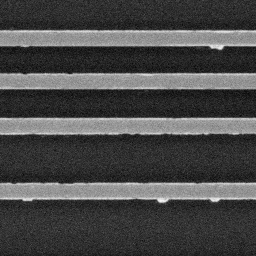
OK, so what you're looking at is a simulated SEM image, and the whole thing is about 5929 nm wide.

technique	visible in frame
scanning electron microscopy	lines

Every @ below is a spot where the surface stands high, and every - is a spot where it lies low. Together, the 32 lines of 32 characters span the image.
--------------------------------
--------------------------------
--------------------------------
--------------------------------
@@@@@@@@@@@@@@@@@@@@@@@@@@@@@@@@
@@@@@@@@@@@@@@@@@@@@@@@@@@@@@@@@
--------------------------------
--------------------------------
--------------------------------
@@@@@@@@@@@@@@@@@@@@@@@@@@@@@@@@
@@@@@@@@@@@@@@@@@@@@@@@@@@@@@@@@
--------------------------------
--------------------------------
--------------------------------
--------------------------------
@@@@@@@@@@@@@@@@@@@@@@@@@@@@@@@@
@@@@@@@@@@@@@@@@@@@@@@@@@@@@@@@@
--------------------------------
--------------------------------
--------------------------------
--------------------------------
--------------------------------
--------------------------------
@@@@@@@@@@@@@@@@@@@@@@@@@@@@@@@@
@@@@@@@@@@@@@@@@@@@@@@@@@@@@@@@@
--------------------------------
--------------------------------
--------------------------------
--------------------------------
--------------------------------
--------------------------------
--------------------------------